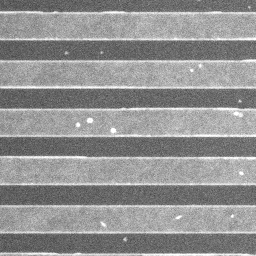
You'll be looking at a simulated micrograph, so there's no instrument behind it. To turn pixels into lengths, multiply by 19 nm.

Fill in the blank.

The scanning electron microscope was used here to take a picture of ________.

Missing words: lines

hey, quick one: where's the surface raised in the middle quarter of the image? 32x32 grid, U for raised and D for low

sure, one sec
UUUUUUUUUUUUUUUUUUUUUUUUUUUUUUUU
UUUUUUUUUUUUUUUUUUUUUUUUUUUUUUUU
UUUUUUUUUUUUUUUUUUUUUUUUUUUUUUUU
UUUUUUUUUUUUUUUUUUUUUUUUUUUUUUUU
UUUUUUUUUUUUUUUUUUUUUUUUUUUUUUUU
UUUUUUUUUUUUUUUUUUUUUUUUUUUUUUUU
DDDDDDDDDDDDDDDDDDDDDDDDDDDDDDDD
DDDDDDDDDDDDDDDDDDDDDDDDDDDDDDDD
DDDDDDDDDDDDDDDDDDDDDDDDDDDDDDDD
DDDDDDDDDDDDDDDDDDDDDDDDDDDDDDDD
DDDDDDDDDDDDDDDDDDDDDDDDDDDDDDDD
UUUUUUUUUUUUUUUUUUUUUUUUUUUUUUUU
UUUUUUUUUUUUUUUUUUUUUUUUUUUUUUUU
UUUUUUUUUUUUUUUUUUUUUUUUUUUUUUUU
UUUUUUUUUUUUUUUUUUUUUUUUUUUUUUUU
UUUUUUUUUUUUUUUUUUUUUUUUUUUUUUUU
UUUUUUUUUUUUUUUUUUUUUUUUUUUUUUUU
UUUUUUUUUUUUUUUUUUUUUUUUUUUUUUUU
DDDDDDDDDDDDDDDDDDDDDDDDDDDDDDDD
DDDDDDDDDDDDDDDDDDDDDDDDDDDDDDDD
DDDDDDDDDDDDDDDDDDDDDDDDDDDDDDDD
DDDDDDDDDDDDDDDDDDDDDDDDDDDDDDDD
DDDDDDDDDDDDDDDDDDDDDDDDDDDDDDDD
UUUUUUUUUUUUUUUUUUUUUUUUUUUUUUUU
UUUUUUUUUUUUUUUUUUUUUUUUUUUUUUUU
UUUUUUUUUUUUUUUUUUUUUUUUUUUUUUUU
UUUUUUUUUUUUUUUUUUUUUUUUUUUUUUUU
UUUUUUUUUUUUUUUUUUUUUUUUUUUUUUUU
UUUUUUUUUUUUUUUUUUUUUUUUUUUUUUUU
UUUUUUUUUUUUUUUUUUUUUUUUUUUUUUUU
DDDDDDDDDDDDDDDDDDDDDDDDDDDDDDDD
DDDDDDDDDDDDDDDDDDDDDDDDDDDDDDDD